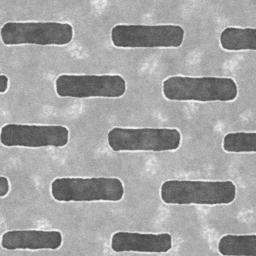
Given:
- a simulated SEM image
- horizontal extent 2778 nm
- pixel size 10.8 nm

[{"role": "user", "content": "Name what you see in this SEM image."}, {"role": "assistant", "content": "a regular array of holes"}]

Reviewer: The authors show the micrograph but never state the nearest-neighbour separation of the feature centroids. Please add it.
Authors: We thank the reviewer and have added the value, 74.8 pixels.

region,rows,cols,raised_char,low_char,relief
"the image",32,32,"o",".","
oooooooooooooooooooooooooooooooo
oooooooooooooooooooooooooooooooo
oooooooooooooooooooooooooooooooo
.........ooooo.........ooooo...o
.........ooooo.........ooooo....
o.oo....oooooo.........ooooo....
oooooooooooooooooooooooooooooooo
oooooooooooooooooooooooooooooooo
oooooooooooooooooooooooooooooooo
.ooooooo.......ooooooo.ooooooooo
.oooooo.........oooo.........ooo
.oooooo.........oooo..........oo
ooooooooooooooooooooo........ooo
oooooooooooooooooooooooooooooooo
oooooooooooooooooooooooooooooooo
o.oooooooooooooooooooooooooooooo
.........ooooo........oooooooo.o
.........oooo..........ooooo....
oooooooooooooo........oooooo....
oooooooooooooooooooooooooooooooo
oooooooooooooooooooooooooooooooo
oooooooooooooooooooooooooooooooo
.oooooo........oooooo.oooooooooo
.ooooo.........ooooo.........ooo
.oooooo........ooooo.........ooo
ooooooooooooooooooooo..o...ooooo
oooooooooooooooooooooooooooooooo
oooooooooooooooooooooooooooooooo
oooooooooooooooooooooooooooooooo
........oooooo.......ooooooo....
........oooooo.......oooooo.....
ooooooooooooooooo....oooooo.....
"